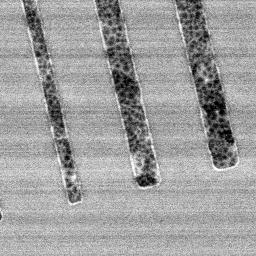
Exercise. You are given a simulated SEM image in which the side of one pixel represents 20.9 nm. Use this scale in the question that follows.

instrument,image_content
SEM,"one or a few lines or trenches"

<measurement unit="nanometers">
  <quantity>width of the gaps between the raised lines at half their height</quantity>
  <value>1150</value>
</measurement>